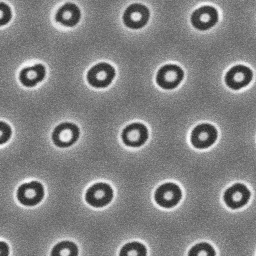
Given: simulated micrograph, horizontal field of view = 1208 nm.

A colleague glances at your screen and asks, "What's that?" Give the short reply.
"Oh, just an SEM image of a regular array of ring-shaped grooves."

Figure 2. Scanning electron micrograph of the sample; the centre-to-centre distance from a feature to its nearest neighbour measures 0.321 microns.